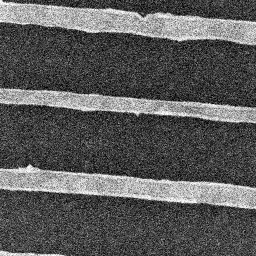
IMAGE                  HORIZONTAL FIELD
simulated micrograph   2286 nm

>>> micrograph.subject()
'one or a few lines or trenches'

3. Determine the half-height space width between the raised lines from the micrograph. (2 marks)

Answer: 586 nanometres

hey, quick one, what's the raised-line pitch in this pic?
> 734 nanometers